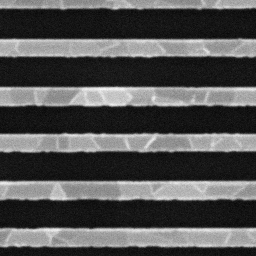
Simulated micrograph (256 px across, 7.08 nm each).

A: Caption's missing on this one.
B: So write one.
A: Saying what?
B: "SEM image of lines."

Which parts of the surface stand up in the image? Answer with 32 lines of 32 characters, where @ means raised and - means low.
@@@@@@@@@@@@@@@@@@@@@@@@@@@@@@@@
--------------------------------
--------------------------------
--------------------------------
--------------------------------
@@@@@@@@@@@@@@@@@@@@@@@@@@@@@@@@
@@@@@@@@@@@@@@@@@@@@@@@@@@@@@@@@
--------------------------------
--------------------------------
--------------------------------
--------------------------------
@@@@@@@@@@@@@@@@@@@@@@@@@@@@@@@@
@@@@@@@@@@@@@@@@@@@@@@@@@@@@@@@@
--------------------------------
--------------------------------
--------------------------------
--------------------------------
@@@@@@@@@@@@@@@@@@@@@@@@@@@@@@@@
@@@@@@@@@@@@@@@@@@@@@@@@@@@@@@@@
--------------------------------
--------------------------------
--------------------------------
--------------------------------
@@@@@@@@@@@@@@@@@@@@@@@@@@@@@@@@
@@@@@@@@@@@@@@@@@@@@@@@@@@@@@@@@
--------------------------------
--------------------------------
--------------------------------
--------------------------------
@@@@@@@@@@@@@@@@@@@@@@@@@@@@@@@@
@@@@@@@@@@@@@@@@@@@@@@@@@@@@@@@@
--------------------------------